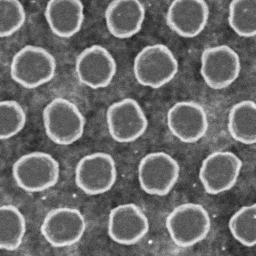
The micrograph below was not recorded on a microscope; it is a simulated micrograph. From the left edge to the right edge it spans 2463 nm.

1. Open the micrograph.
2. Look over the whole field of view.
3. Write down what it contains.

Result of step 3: a regular array of raised bodies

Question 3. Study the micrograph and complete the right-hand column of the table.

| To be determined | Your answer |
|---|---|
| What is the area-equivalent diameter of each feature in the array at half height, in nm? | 366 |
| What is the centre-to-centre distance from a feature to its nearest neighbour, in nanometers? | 574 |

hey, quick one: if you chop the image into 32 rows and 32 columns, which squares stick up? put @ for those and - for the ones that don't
@@----@@@@----@@@-----@@@----@@@
@@@---@@@@----@@@@---@@@@@---@@@
@@@---@@@@---@@@@@---@@@@@---@@@
@@-----@@@----@@@-----@@@----@@@
---------------@----------------
--------------------------------
---@@------@@-----@@@-----@@@---
--@@@@----@@@@---@@@@@---@@@@@--
--@@@@@---@@@@---@@@@@---@@@@@--
--@@@@----@@@@---@@@@@----@@@@--
---@@------@@-----@@------@@----
--------------------------------
--------------------------------
@@----@@@-----@@@-----@@@----@@@
@@@---@@@@----@@@@---@@@@@---@@@
@@@---@@@@----@@@@---@@@@@---@@@
@@----@@@@----@@@@----@@@----@@@
-------@@------@-------@------@@
--------------------------------
----@@------@------@@-----@@@---
--@@@@@---@@@@----@@@@---@@@@@--
--@@@@@---@@@@---@@@@@---@@@@@--
--@@@@@---@@@@----@@@@---@@@@---
---@@@----@@@@----@@@-----@@----
--------------------------------
--------------------------------
@@-----@@@----@@@-----@@@-----@@
@@@---@@@@----@@@@---@@@@@---@@@
@@@--@@@@@----@@@@---@@@@@---@@@
@@@---@@@@----@@@@----@@@----@@@
@@-----@@--------------@-------@
--------------------------------